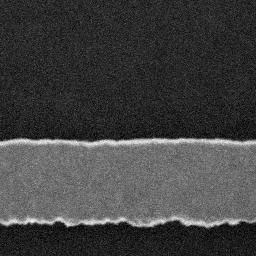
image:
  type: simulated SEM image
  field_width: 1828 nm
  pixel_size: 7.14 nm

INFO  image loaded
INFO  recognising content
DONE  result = one or a few lines or trenches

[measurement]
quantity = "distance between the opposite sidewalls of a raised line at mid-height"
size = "570 nm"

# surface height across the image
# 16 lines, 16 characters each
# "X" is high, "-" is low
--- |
----------------
----------------
----------------
----------------
----------------
----------------
----------------
----------------
----------------
XXXXXXXXXXXXXXXX
XXXXXXXXXXXXXXXX
XXXXXXXXXXXXXXXX
XXXXXXXXXXXXXXXX
XXXXXXXXXXXXXXXX
----------------
----------------